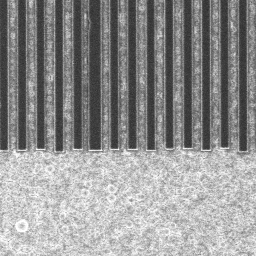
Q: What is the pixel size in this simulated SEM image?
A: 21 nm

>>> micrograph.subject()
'parallel lines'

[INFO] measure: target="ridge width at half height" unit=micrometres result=0.197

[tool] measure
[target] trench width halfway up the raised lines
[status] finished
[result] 178 nm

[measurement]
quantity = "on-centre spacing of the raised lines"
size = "386 nanometers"